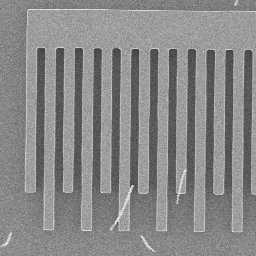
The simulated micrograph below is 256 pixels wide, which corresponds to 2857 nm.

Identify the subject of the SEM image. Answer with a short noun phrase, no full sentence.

groups of lines, slits or small figures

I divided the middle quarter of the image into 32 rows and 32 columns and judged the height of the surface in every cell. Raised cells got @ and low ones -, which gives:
@@@--@@---@@--@@@--@@---@@--@@@-
@@@--@@---@@--@@@--@@---@@--@@@-
@@@--@@---@@--@@@--@@---@@--@@@-
@@@--@@---@@--@@@--@@---@@--@@@-
@@@--@@---@@--@@@--@@---@@--@@@-
@@@--@@---@@--@@@--@@---@@--@@@-
@@@--@@---@@--@@@--@@---@@--@@@-
@@@--@@--@@@--@@@--@@---@@--@@@-
@@---@@--@@@--@@@--@@---@@--@@@-
@@---@@--@@@--@@@--@@---@@--@@@-
@@---@@--@@@--@@@--@@---@@--@@@-
@@---@@--@@@--@@@--@@---@@--@@@-
@@---@@--@@@--@@@--@@---@@--@@@-
@@---@@--@@@--@@@--@@---@@--@@@-
@@---@@--@@@--@@@--@@---@@--@@@-
@@---@@--@@@--@@@--@@---@@--@@@-
@@---@@--@@@--@@@--@@---@@--@@@-
@@---@@--@@@--@@@--@@---@@--@@@-
@@---@@--@@@--@@---@@---@@--@@@-
@@---@@--@@@--@@---@@---@@--@@@-
@@---@@--@@@--@@---@@---@@--@@@-
@@---@@--@@@--@@---@@--@@@--@@@-
@@---@@--@@@--@@---@@--@@@--@@@-
@@---@@--@@@--@@---@@--@@@--@@@-
@@---@@--@@@--@@---@@--@@@--@@@-
@@---@@--@@@--@@---@@--@@@--@@@-
@@---@@--@@@--@@---@@--@@@--@@@-
@@---@@--@@@--@@---@@--@@@--@@--
@@---@@--@@@--@@---@@--@@@--@@--
@@---@@--@@@--@@---@@--@@@--@@--
@@---@@--@@@--@@@--@@--@@@--@@--
@@---@@--@@@--@@@--@@--@@@--@@--